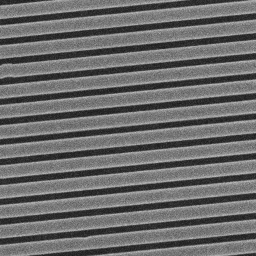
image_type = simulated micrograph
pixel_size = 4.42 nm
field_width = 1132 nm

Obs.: parallel lines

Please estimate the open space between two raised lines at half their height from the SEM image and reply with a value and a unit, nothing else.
28 nanometres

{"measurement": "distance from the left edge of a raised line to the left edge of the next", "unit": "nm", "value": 87.7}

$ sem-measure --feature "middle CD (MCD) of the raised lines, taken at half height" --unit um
0.0566